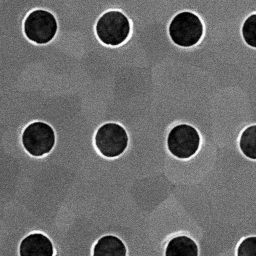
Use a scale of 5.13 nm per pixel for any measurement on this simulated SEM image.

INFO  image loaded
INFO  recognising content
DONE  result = holes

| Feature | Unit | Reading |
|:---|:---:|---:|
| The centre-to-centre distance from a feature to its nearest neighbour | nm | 374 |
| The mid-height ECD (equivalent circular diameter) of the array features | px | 33.7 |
